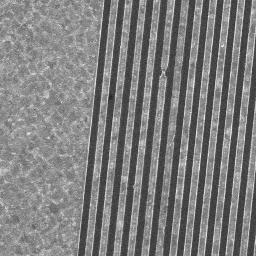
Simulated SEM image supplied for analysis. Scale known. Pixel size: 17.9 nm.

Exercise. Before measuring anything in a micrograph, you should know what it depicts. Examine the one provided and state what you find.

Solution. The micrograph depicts parallel lines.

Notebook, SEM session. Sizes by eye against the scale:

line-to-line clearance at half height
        133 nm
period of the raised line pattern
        250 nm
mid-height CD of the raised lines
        0.116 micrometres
